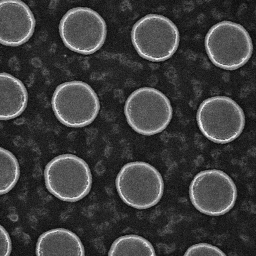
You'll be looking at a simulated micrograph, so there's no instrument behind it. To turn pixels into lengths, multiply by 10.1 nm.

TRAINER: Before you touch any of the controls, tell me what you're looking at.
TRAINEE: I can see a regular array of raised bodies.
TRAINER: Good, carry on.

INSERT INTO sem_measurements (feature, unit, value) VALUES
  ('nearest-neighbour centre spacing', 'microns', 0.74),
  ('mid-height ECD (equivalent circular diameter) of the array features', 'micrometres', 0.454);